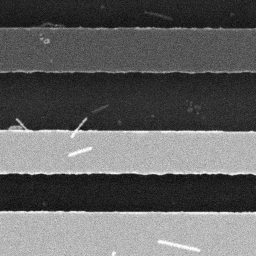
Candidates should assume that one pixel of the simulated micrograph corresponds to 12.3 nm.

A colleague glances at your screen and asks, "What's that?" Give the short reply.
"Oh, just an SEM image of lines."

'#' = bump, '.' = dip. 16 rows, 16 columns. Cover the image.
................
................
################
################
##.#############
................
................
................
################
################
################
................
................
################
################
################